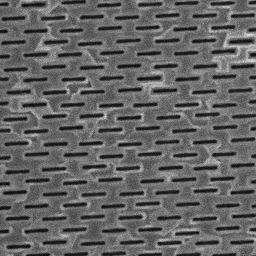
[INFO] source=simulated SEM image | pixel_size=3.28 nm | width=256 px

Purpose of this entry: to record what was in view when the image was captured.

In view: a regular array of holes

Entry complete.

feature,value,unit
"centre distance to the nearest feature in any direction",0.0692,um